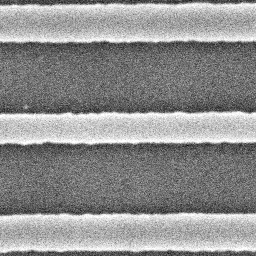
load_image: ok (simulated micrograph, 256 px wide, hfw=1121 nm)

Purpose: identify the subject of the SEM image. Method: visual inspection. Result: lines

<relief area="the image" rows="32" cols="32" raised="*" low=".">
.......................***....**
********************************
********************************
********************************
********************************
................................
................................
................................
................................
................................
................................
................................
................................
................................
********************************
********************************
********************************
********************************
................................
................................
................................
................................
................................
................................
................................
................................
................................
********************************
********************************
********************************
********************************
................................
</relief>